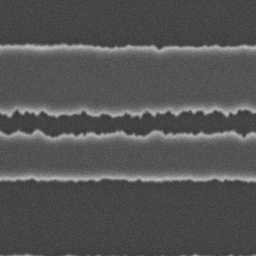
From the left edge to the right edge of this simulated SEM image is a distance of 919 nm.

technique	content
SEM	lines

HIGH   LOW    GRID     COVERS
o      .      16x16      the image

................
................
................
oooooooooooooooo
oooooooooooooooo
oooooooooooooooo
oooooooooooooooo
oooooooooooooooo
oooooooooooooooo
oooooooooooooooo
oooooooooooooooo
................
................
................
................
................